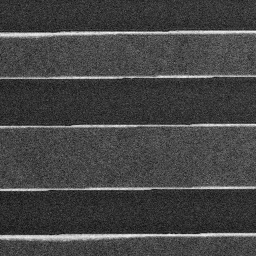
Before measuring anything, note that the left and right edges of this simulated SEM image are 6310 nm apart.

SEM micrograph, lines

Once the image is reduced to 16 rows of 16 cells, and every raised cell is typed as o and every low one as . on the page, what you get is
................
................
oooooooooooooooo
oooooooooooooooo
oooooooooooooooo
................
................
................
oooooooooooooooo
oooooooooooooooo
oooooooooooooooo
oooooooooooooooo
................
................
................
oooooooooooooooo